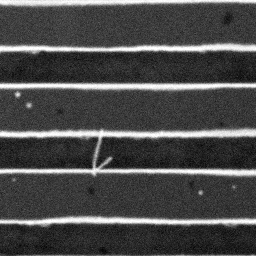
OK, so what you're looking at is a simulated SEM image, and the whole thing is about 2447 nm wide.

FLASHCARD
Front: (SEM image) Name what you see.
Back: lines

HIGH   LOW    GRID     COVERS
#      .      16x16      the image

################
################
################
................
................
################
################
################
................
................
................
################
################
################
................
................